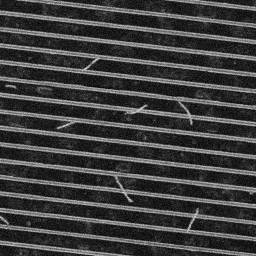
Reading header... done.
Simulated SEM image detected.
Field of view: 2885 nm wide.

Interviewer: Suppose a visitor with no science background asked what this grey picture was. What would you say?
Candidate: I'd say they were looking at parallel lines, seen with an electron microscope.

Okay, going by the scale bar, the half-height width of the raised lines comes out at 32.2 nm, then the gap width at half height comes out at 0.15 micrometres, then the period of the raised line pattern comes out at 0.184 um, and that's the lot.